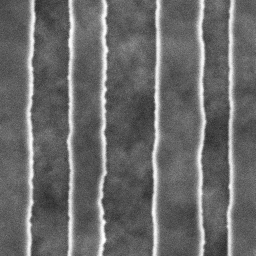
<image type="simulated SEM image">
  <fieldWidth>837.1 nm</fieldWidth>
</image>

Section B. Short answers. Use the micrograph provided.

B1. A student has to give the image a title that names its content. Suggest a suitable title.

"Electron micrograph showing lines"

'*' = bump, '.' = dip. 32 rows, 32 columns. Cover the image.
****.....****.......*****....***
****.....****.......*****....***
****.....****.......*****....***
****.....****.......*****....***
****.....****.......*****....***
****.....****.......*****....***
****.....****.......*****....***
****.....****.......*****....***
****.....****.......*****....***
****.....****.......*****....***
****.....****.......*****....***
****.....****......******....***
****.....****......******....***
****.....****......******....***
****.....****......*******...***
****.....****......*******...***
****.....****.......*****....***
****....*****......******....***
****.....****......******....***
****.....****......******....***
****.....****......******....***
****.....****......******....***
****.....****......******....***
****.....****......******....***
****.....****......******....***
****.....****......******....***
****.....****......******...****
****.....****......******...****
****.....****......******...****
****.....****......******....***
****.....****......******....***
****.....****......******....***